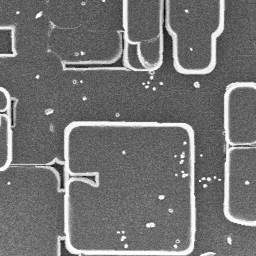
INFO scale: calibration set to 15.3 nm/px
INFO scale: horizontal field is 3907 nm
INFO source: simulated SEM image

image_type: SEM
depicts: wiring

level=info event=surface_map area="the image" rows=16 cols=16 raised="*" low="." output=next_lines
........******..
........******..
........**.**...
.........*.**...
................
...............*
..............**
..............**
*...********..**
*...********..**
....********..**
....********..**
....********..**
....********..**
....********....
.....*******....